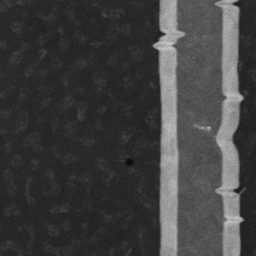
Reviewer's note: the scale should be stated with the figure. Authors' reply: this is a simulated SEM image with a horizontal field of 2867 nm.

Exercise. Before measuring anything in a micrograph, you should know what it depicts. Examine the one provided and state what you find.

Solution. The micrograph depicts one or a few lines or trenches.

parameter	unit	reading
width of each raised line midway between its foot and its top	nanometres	686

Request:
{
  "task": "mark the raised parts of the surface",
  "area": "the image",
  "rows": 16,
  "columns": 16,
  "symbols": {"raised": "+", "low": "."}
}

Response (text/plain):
...........+++..
...........+++..
..........++++..
..........++++..
..........++++..
...........+++..
...........+++..
...........+++..
...........+++..
...........+++..
...........+++..
...........+++..
...........+++..
...........++++.
...........+++..
...........+++..